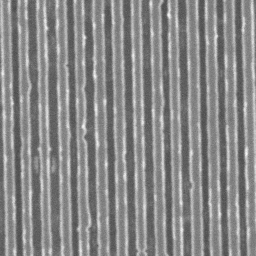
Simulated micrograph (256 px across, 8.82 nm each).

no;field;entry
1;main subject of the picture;parallel lines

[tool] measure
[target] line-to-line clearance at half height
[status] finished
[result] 74.9 nanometres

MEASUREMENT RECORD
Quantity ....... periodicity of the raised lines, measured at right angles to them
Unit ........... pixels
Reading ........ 18.6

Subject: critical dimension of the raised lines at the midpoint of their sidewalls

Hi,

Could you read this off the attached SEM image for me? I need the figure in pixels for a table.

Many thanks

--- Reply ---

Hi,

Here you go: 9.37